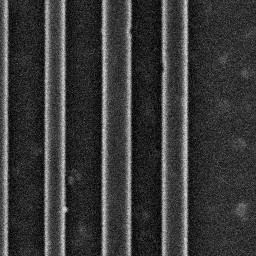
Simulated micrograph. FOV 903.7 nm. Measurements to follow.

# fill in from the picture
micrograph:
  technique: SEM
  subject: one or a few lines or trenches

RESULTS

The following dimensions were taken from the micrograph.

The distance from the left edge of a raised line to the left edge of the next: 212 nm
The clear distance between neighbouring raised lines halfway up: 140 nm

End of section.